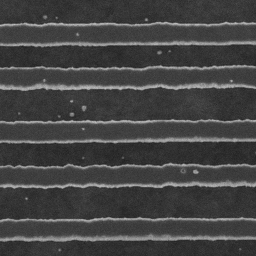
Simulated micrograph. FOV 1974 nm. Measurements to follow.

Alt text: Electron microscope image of lines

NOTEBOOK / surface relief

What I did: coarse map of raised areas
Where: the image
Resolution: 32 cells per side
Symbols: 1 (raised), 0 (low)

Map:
00000000000000000000000000000000
00000000000000000000000000000000
00000000000000000000000000000000
11111111111111111111111111111111
11111111111111111111111111111111
11111111111111111111110101011000
00000000000000000000000000000000
00000000000000000000000000000000
01001100000000110011111111111111
11111111111111111111111111111111
11111111111111111111111111111111
00000000000000000000000000000000
00000000000000000000000000000000
00000000000000000000000000000000
00000000000000000000000000000000
11111111111111111111111111111111
11111111111111111111111111111111
11111111111111111111111111111111
00000000000000000000000000000000
00000000000000000000000000000000
00000000000000000000000000000000
11111111111111111111111111111111
11111111111111111111111111111111
00000100000000000000000000000000
00000000000000000000000000000000
00000000000000000000000000000000
00000000000000000000000000000000
11111111111111111111111111111111
11111111111111111111111111111111
11111111111111111111111111111111
00000000000000000000000000000000
00000000000000000000000000000000